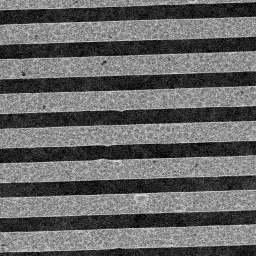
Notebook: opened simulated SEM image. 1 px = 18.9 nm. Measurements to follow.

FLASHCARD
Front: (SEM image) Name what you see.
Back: parallel lines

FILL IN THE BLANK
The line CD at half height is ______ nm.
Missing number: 366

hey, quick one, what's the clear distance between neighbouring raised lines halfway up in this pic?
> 286 nm